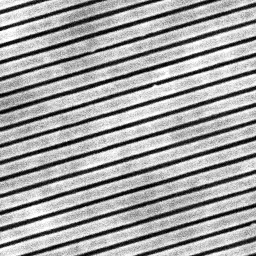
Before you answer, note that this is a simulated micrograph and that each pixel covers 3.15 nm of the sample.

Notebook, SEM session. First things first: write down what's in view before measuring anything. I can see parallel lines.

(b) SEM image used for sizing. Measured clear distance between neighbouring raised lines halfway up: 14.8 nanometres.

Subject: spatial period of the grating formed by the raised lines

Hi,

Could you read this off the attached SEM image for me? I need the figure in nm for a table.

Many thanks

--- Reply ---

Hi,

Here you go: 50.5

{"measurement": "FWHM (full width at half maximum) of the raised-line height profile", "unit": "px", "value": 12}